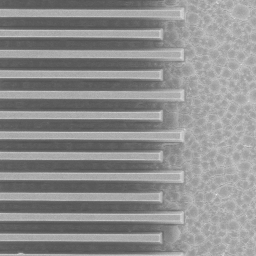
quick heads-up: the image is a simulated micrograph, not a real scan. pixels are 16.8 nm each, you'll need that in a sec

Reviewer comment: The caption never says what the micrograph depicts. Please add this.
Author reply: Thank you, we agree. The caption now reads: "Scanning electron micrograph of parallel lines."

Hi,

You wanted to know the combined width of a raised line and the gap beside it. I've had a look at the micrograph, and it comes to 0.343 um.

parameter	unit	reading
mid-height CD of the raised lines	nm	153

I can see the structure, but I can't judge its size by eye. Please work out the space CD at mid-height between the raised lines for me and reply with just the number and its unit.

183 nanometres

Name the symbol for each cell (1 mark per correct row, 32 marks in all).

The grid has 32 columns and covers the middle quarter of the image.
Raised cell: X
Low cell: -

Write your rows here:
--------------------------------
--------------------------------
XXXXXXXXXXXXXXXXXXXXXXXX--------
XXXXXXXXXXXXXXXXXXXXXXXX--------
--------------------------------
--------------------------------
--------------------------------
XXXXXXXXXXXXXXXXXXXXXXXXXXXXXX--
XXXXXXXXXXXXXXXXXXXXXXXXXXXXXX--
--------------------------------
--------------------------------
--------------------------------
XXXXXXXXXXXXXXXXXXXXXXXX--------
XXXXXXXXXXXXXXXXXXXXXXXX--------
--------------------------------
--------------------------------
--------------------------------
XXXXXXXXXXXXXXXXXXXXXXXXXXXXX---
XXXXXXXXXXXXXXXXXXXXXXXXXXXXX---
--------------------------------
--------------------------------
--------------------------------
XXXXXXXXXXXXXXXXXXXXXXXX--------
XXXXXXXXXXXXXXXXXXXXXXXX--------
--------------------------------
--------------------------------
--------------------------------
XXXXXXXXXXXXXXXXXXXXXXXXXXXXX---
XXXXXXXXXXXXXXXXXXXXXXXXXXXXX---
--------------------------------
--------------------------------
--------------------------------